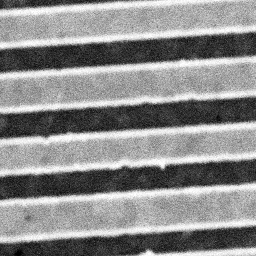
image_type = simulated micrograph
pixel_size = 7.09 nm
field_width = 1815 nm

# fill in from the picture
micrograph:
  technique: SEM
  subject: one or a few lines or trenches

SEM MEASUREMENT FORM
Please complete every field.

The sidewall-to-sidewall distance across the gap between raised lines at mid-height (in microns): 0.22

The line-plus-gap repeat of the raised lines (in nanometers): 452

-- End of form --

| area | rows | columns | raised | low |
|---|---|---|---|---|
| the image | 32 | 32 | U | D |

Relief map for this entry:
DDDDDDDDDDDDDDDDDUUUUUUUUUUUUUUU
DDDUUUUUUUUUUUUUUUUUUUUUUUUUUUUU
UUUUUUUUUUUUUUUUUUUUUUUUUUUUUUUU
UUUUUUUUUUUUUUUUUUUUUUUUUUUUUUUU
UUUUUUUUUUUUUUUUUUDDDDDDDDDDDDDD
UUUDDDDDDDDDDDDDDDDDDDDDDDDDDDDD
DDDDDDDDDDDDDDDDDDDDDDDDDDDDDDDD
DDDDDDDDDDDDDDDDDDDDDDDDDDDDDDDU
DDDDDDDDDDDDDDDDUUUUUUUUUUUUUUUU
DUUUUUUUUUUUUUUUUUUUUUUUUUUUUUUU
UUUUUUUUUUUUUUUUUUUUUUUUUUUUUUUU
UUUUUUUUUUUUUUUUUUUUUUUUUUUUUUUU
UUUUUUUUUUUUUUUUUUDUDDDDDDDDDDDD
UUUUUDDDDDDDDDDDDDDDDDDDDDDDDDDD
DDDDDDDDDDDDDDDDDDDDDDDDDDDDDDDD
DDDDDDDDDDDDDDDDDDDDDDDDDDDDDDDD
DDDDDDDDDDDDDDDDDDDUUUUUUUUUUUUU
DDDDDDUUUUUUUUUUUUUUUUUUUUUUUUUU
UUUUUUUUUUUUUUUUUUUUUUUUUUUUUUUU
UUUUUUUUUUUUUUUUUUUUUUUUUUUUUUUD
UUUUUUUUUUUUUUUDDDDDDDDDDDDDDDDD
UUDDDDDDDDDDDDDDDDDDDDDDDDDDDDDD
DDDDDDDDDDDDDDDDDDDDDDDDDDDDDDDD
DDDDDDDDDDDDDDDDDDDDDDDDDDDDDUUU
DDDDDDDDDDDDDDUUUUUUUUUUUUUUUUUU
UUUUUUUUUUUUUUUUUUUUUUUUUUUUUUUU
UUUUUUUUUUUUUUUUUUUUUUUUUUUUUUUU
UUUUUUUUUUUUUUUUUUUUUUUUUUUUUUUU
UUUUUUUUUUUUUUUUUUUUUDDDDDDDDDDD
UUUUUUUDDDDDDDDDDDDDDDDDDDDDDDDD
DDDDDDDDDDDDDDDDDDDDDDDDDDDDDDDD
DDDDDDDDDDDDDDDDDDDDDDDDDDDDDDUU